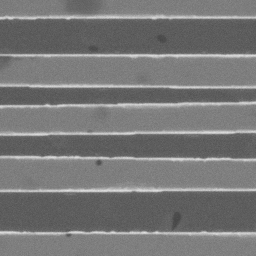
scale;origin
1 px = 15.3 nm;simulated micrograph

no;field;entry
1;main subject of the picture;lines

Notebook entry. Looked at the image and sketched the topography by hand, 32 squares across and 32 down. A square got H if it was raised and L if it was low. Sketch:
HHHHHHHHHHHHHHHHHHHHHHHHHHHHHHHH
HHHHHHHHHHHHHHHHHHHHHHHHHHHHHHHH
LLLLLLLLLLLLLLLLLLLLLLLLLLLLLLLL
LLLLLLLLLLLLLLLLLLLLLLLLLLLLLLLL
LLLLLLLLLLLLLLLLLLLLLLLLLLLLLLLL
LLLLLLLLLLLLLLLLLLLLLLLLLLLLLLLL
LLLLLLLLLLLLLLLLLLLLLLLLLLLLLLLL
HHHHHHHHHHHHHHHHHHHHHHHHHHHHHHHH
HHHHHHHHHHHHHHHHHHHHHHHHHHHHHHHH
HHHHHHHHHHHHHHHHHHHHHHHHHHHHHHHH
HHHHHHHHHHHHHHHHHHHHHHHHHHHHHHHH
LLLLLLLLLLLLLLLLLLLLLLLLLLLLLLLL
LLLLLLLLLLLLLLLLLLLLLLLLLLLLLLLL
HHHHHHHHHHHHHHHHHHHHHHHHHHHHHHHH
HHHHHHHHHHHHHHHHHHHHHHHHHHHHHHHH
HHHHHHHHHHHHHHHHHHHHHHHHHHHHHHHH
HHHHHHHHHHHHHHHHHHHHHHHHHHHHHHHH
LLLLLLLLLLLLLLLLLLLLLLLLLLLLLLLL
LLLLLLLLLLLLLLLLLLLLLLLLLLLLLLLL
LLLLLLLLLLLLLLLLLLLLLLLLLLLLLLLL
HHHHHHHHHHHHHHHHHHHHHHHHHHHHHHHH
HHHHHHHHHHHHHHHHHHHHHHHHHHHHHHHH
HHHHHHHHHHHHHHHHHHHHHHHHHHHHHHHH
HHHHHHHHHHHHHHHHHHHHHHHHHHHHHHHH
LLLLLLLLLLLLLLLLLLLLLLLLLLLLLLLL
LLLLLLLLLLLLLLLLLLLLLLLLLLLLLLLL
LLLLLLLLLLLLLLLLLLLLLLLLLLLLLLLL
LLLLLLLLLLLLLLLLLLLLLLLLLLLLLLLL
LLLLLLLLLLLLLLLLLLLLLLLLLLLLLLLL
HHHHHHHHHHHHHHHHHHHHHHHHHHHHHHHH
HHHHHHHHHHHHHHHHHHHHHHHHHHHHHHHH
HHHHHHHHHHHHHHHHHHHHHHHHHHHHHHHH